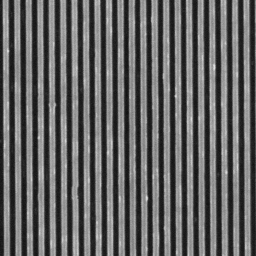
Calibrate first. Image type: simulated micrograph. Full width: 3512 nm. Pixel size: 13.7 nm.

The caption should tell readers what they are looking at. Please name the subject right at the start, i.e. parallel lines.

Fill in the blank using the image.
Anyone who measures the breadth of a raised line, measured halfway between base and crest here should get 66.9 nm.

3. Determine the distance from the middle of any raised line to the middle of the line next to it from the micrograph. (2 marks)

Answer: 157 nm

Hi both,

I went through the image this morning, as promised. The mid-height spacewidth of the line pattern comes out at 0.0909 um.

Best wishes